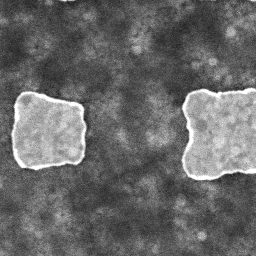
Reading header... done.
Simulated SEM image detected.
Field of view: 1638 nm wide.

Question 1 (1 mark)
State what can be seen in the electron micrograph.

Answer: raised bodies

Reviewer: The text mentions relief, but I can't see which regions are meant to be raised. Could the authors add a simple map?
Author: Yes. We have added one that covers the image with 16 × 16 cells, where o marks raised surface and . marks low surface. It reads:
................
................
................
................
................
................
.oooo.......oooo
.oooo.......oooo
.oooo.......oooo
.oooo.......oooo
............oooo
................
................
................
................
................